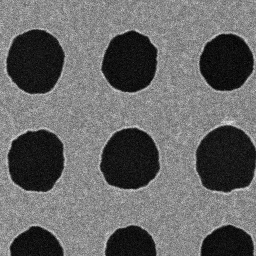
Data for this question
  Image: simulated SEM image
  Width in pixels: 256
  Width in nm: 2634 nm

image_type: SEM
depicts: holes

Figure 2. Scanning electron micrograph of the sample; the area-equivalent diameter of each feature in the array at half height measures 627 nm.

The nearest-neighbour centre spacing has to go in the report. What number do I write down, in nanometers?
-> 974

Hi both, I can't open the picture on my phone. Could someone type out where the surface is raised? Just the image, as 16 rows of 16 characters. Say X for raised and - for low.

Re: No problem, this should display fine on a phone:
XXXXXXXXXXXXXXXX
XXXXXXXXXXXXXXXX
X---XXX--XXXX--X
----XX----XXX---
----XX----XXX---
X--XXXX--XXXX--X
XXXXXXXXXXXXXXXX
XXXXXXXXXXXXXXXX
X---XXX--XXXX--X
X---XX----XX----
X---XX----XX----
X--XXXX--XXXX---
XXXXXXXXXXXXXXXX
XXXXXXXXXXXXXXXX
X--XXXX--XXXX--X
X---XXX---XXX---